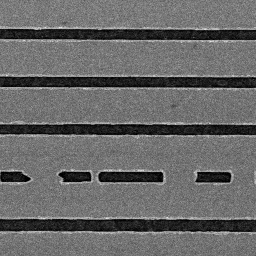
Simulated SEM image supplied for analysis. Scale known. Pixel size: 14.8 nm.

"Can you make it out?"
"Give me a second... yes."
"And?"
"parallel lines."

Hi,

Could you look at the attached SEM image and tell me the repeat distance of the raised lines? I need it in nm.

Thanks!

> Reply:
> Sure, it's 701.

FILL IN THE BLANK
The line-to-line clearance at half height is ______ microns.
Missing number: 0.173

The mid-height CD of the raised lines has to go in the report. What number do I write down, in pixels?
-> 36.1